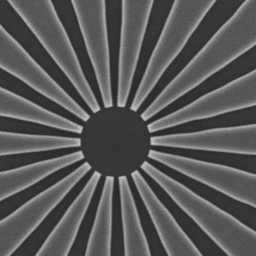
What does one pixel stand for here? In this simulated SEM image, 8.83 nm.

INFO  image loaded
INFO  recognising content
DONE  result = groups of lines, slits or small figures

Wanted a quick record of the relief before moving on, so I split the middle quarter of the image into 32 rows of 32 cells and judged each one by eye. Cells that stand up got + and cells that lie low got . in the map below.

++++...++++...++++...+++++.....+
++++....+++...++++...++++.....++
.++++...+++...+++...++++.....+++
.++++...+++...+++...++++....++++
..++++..+++...+++..++++....+++++
...+++...++...+++..+++....++++++
...++++..++...++..++++...++++++.
+...+++..+++..++..+++...++++++..
++...+++..++..++..++...+++++....
+++...++..++..+..+++..+++++.....
++++..+++........++..++++......+
.++++..++............+++.....+++
...+++..............+++....+++++
....++..............+....+++++++
++.....................++++++++.
++++.................++++++.....
.+++.................++.........
...............................+
+.....................++++++++++
++++..................++++++++++
+..........................+++++
................................
..+++................+++++......
+++++.................++++++++..
+++.....................++++++++
+....+..............++....++++++
...+++..............+++.....++++
..+++..++........++..++++.....++
++++...++..+..++.+++..+++++.....
+++...++..++..++..++...+++++....
++....++..++..++..+++...++++++..
+....++...++..+++..+++...+++++++